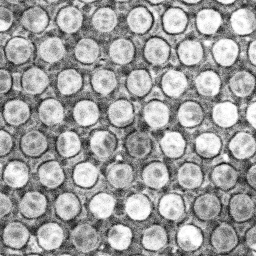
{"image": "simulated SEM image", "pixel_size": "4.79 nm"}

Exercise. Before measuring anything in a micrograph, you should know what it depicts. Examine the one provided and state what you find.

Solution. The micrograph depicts a regular array of raised bodies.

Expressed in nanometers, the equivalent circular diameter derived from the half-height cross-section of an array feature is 115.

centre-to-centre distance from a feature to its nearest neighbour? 164 nm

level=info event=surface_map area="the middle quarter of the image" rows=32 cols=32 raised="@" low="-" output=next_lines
--------------------------------
--------------------------------
@@@@----@@@@-----@@@@-----@@@@--
@@@@---@@@@@@---@@@@@----@@@@@--
@@@@---@@@@@@---@@@@@@---@@@@@--
@@@@---@@@@@@---@@@@@@---@@@@@--
@@@-----@@@@----@@@@@----@@@@@--
-----------------@@@--@@--@@@---
-----------------------@--------
----@@@-------@@------@@--------
---@@@@@----@@@@@----@@@@----@@@
---@@@@@---@@@@@@---@@@@@@---@@@
---@@@@@---@@@@@@---@@@@@@---@@@
---@@@@@----@@@@@---@@@@@@---@@@
----@@@@----@@@@@----@@@@@---@@@
----------------------@@--------
--------------------------------
@@@-----@@@@-----@@@------@@@---
@@@----@@@@@@---@@@@@----@@@@---
@@@@---@@@@@@---@@@@@----@@@@@--
@@@@---@@@@@@---@@@@@----@@@@@--
@@@@---@@@@@----@@@@@----@@@@@--
@@------@@@@-----@@@@----@@@@---
--------------------------------
--------------------------------
----@@@------@@@------@@@-----@@
---@@@@@----@@@@@---@@@@@----@@@
---@@@@@---@@@@@@---@@@@@@---@@@
---@@@@@---@@@@@@---@@@@@@---@@@
---@@@@@---@@@@@----@@@@@----@@@
-----@-------@@-------@@------@@
--------------------------------